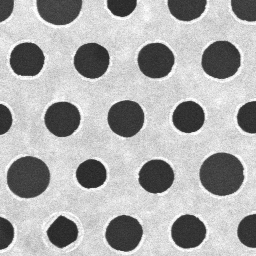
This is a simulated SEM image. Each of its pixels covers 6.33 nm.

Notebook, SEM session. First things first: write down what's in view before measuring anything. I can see a regular array of holes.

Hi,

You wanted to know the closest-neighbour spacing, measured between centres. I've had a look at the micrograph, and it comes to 403 nanometres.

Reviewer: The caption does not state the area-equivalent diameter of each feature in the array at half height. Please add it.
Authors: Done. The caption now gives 224 nanometers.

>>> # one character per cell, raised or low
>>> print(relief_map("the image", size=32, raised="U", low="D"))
DDUUUDDDDDUUUDDDDUUUUDDDDDUUUDDD
DUUUUDDDDDUUUUDDDUUUUDDDDUUUUDDD
UUUUUUDDDUUUUUUUUUUUUUUDUUUUUUDD
UUUUUUUUUUUUUUUUUUUUUUUUUUUUUUUU
UUUUUUUUUUUUUUUUUUUUUUUUUUUUUUUU
UUDDUUUUUUUDUUUUUUUDUUUUUUDDDUUU
UDDDDUUUUUDDDUUUUUDDDUUUUDDDDDUU
UDDDDDUUUDDDDDUUUDDDDDUUUDDDDDUU
UDDDDUUUUDDDDUUUUDDDDDUUUDDDDDUU
UUUDUUUUUUDDDUUUUUDDDUUUUUDDDUUU
UUUUUUUUUUUUUUUUUUUUUUUUUUUUUUUU
UUUUUUUUUUUUUUUUUUUUUUUUUUUUUUUU
UUUUUUUUUUUUUUUUUUUUUUUUUUUUUUUU
DUUUUUDDDDUUUUDDDDUUUUDDDUUUUUDD
DUUUUUDDDDUUUDDDDDUUUUDDDDUUUUDD
DUUUUUDDDDUUUUDDDDUUUUDDDUUUUUDD
DUUUUUDDDUUUUUDDDUUUUUUDUUUUUUUD
UUUUUUUUUUUUUUUUUUUUUUUUUUUUUUUU
UUUUUUUUUUUUUUUUUUUUUUUUUUUUUUUU
UUUUUUUUUUUUUUUUUUUUUUUUUUDDDUUU
UUDDDDUUUUDDDUUUUUDDDUUUUDDDDDUU
UDDDDDUUUUDDDUUUUDDDDDUUUDDDDDUU
UDDDDDUUUUDDDUUUUDDDDDUUUDDDDDUU
UDDDDDUUUUUDUUUUUUDDDUUUUUDDDDUU
UUDDDUUUUUUUUUUUUUUUUUUUUUUUUUUU
UUUUUUUUUUUUUUUUUUUUUUUUUUUUUUUU
UUUUUUUUUUUUUUUUUUUUUUUUUUUUUUUU
DUUUUUUDDUUUUUDDDUUUUUDDDUUUUUDD
DDUUUUDDDDUUUDDDDDUUUDDDDDUUUUDD
DDUUUUDDDDUUUDDDDDUUUDDDDDUUUUDD
DUUUUUUDDUUUUUDDDUUUUUDDDUUUUUDD
UUUUUUUUUUUUUUUUUUUUUUUUUUUUUUUU